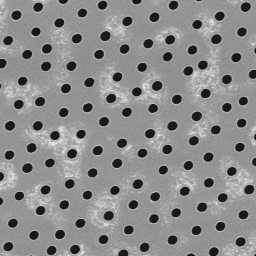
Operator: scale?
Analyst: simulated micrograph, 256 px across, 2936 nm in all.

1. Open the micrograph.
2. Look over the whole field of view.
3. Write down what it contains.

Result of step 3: a regular array of holes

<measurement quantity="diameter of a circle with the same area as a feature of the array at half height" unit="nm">108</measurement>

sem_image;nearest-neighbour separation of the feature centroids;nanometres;258